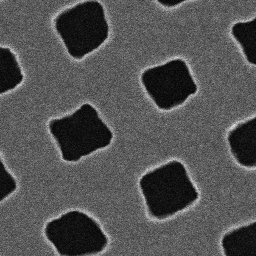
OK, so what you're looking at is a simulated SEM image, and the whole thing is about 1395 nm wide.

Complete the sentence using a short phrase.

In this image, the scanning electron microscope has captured holes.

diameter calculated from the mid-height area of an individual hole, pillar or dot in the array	0.283	microns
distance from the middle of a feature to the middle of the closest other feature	557	nm